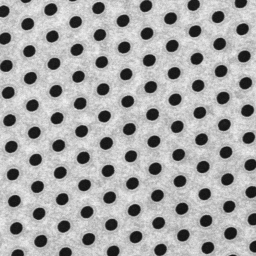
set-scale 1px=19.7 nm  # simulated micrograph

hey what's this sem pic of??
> a regular array of holes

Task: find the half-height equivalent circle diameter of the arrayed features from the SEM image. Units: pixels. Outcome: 13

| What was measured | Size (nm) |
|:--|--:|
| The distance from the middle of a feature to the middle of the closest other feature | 530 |